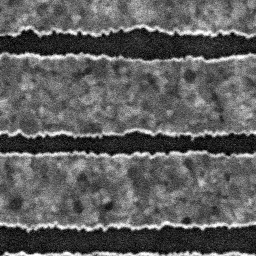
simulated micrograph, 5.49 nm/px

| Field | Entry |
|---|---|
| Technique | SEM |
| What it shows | one or a few lines or trenches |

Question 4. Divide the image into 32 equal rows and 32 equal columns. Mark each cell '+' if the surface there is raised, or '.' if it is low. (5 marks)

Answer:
++++++++++++++++++++++++++++++++
++++++++++++++++++++++++++++++++
++++++++++++++++++++++++++++++++
+++++++++++++++++.++++++++++++++
...............................+
................................
................................
++++++++++++++++++...+++++.+++++
++++++++++++++++++++++++++++++++
++++++++++++++++++++++++++++++++
++++++++++++++++++++++++++++++++
++++++++++++++++++++++++++++++++
++++++++++++++++++++++++++++++++
++++++++++++++++++++++++++++++++
++++++++++++++++++++++++++++++++
++++++++++++++++++++++++++++++++
++++++++++++++++..++++++++++++++
................................
................................
++++++++++++++.+++++++++++++.+++
++++++++++++++++++++++++++++++++
++++++++++++++++++++++++++++++++
++++++++++++++++++++++++++++++++
++++++++++++++++++++++++++++++++
++++++++++++++++++++++++++++++++
++++++++++++++++++++++++++++++++
++++++++++++++++++++++++++++++++
++++++++++++++++++++++++++++++++
...+.......+....................
................................
................................
................................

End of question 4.